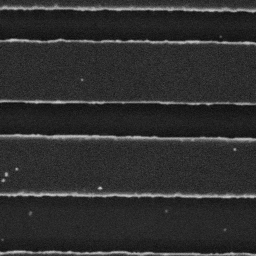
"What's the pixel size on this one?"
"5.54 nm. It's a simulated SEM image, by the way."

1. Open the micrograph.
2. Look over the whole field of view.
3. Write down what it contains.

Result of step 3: lines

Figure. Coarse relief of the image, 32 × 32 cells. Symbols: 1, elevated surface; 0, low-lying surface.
11111111111111111111111111111111
00000000000000000000000000000000
00000000000000000000000000000000
00000000000000000000000000000000
00000000000000000000000000000000
11111111111111111111111111111111
11111111111111111111111111111111
11111111111111111111111111111111
11111111111111111111111111111111
11111111111111111111111111111111
11111111111111111111111111111111
11111111111111111111111111111111
11111111111111111111111111111111
00000000000000000000000000000000
00000000000000000000000000000000
00000000000000000000000000000000
00000000000000000000000000000000
11111111111111111111111111111111
11111111111111111111111111111111
11111111111111111111111111111111
11111111111111111111111111111111
11111111111111111111111111111111
11111111111111111111111111111111
11111111111111111111111111111111
00000000000000000000001111111111
00000000000000000000000000000000
00000000000000000000000000000000
00000000000000000000000000000000
00000000000000000000000000000000
00000000000000000000000000000000
00000000000000000000000000000000
01111111100000110000000000000000